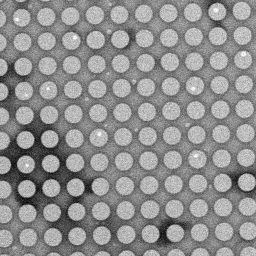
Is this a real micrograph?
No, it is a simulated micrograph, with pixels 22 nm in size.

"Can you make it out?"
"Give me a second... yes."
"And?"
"an array of small figures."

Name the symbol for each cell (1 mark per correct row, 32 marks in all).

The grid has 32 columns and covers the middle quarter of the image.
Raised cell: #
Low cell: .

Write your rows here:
####..####..####..####...###...#
####...###...##....###....#.....
................................
................................
.##....###...###...###...####..#
####..####..####..#####..####..#
####..####..#####.#####..####..#
####...###...###...###....##....
................................
................................
..#....###...###...###...####..#
.###...###...####..####..####..#
####..#####.#####..####..####..#
####...###...###...###....##....
..#.............................
................................
..#.....##...###...###...####..#
.###...####..####..####..####..#
#####..####..####..####..####..#
.####..####..###...####...##....
.###....#.......................
................................
..............##....###...###...
.####..####..####..####..####..#
.####..####..####..####..####..#
.####..####..####..####...###...
..##....##......................
................................
..............##....##....###...
.####..####..####..####..#####.#
.####..####..####..####..#####.#
.####..####..####..####...###...